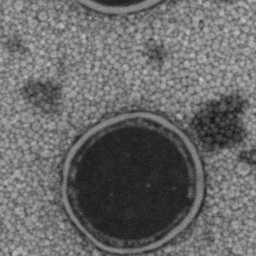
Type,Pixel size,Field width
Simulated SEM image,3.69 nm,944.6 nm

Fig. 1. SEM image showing raised bodies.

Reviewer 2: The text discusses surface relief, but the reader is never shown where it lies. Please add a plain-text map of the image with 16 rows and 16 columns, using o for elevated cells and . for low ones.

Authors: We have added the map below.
......oo........
................
................
................
................
................
................
.......ooo......
.....oooooo.....
.....ooooooo....
....oooooooo....
....ooooooooo...
....oooooooo....
.....ooooooo....
.....oooooo.....
......ooo.......